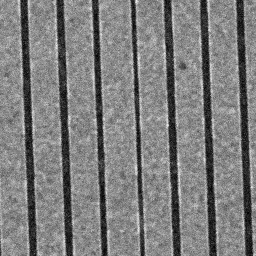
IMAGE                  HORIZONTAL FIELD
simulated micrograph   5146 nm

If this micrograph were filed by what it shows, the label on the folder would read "parallel lines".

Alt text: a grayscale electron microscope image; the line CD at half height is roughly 550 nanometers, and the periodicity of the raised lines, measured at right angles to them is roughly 723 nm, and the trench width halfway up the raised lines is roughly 0.173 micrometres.